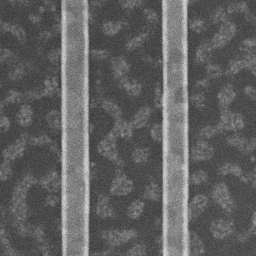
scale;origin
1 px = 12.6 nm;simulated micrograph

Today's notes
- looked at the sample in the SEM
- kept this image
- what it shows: one or a few lines or trenches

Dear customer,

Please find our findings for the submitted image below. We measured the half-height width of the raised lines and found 268 nm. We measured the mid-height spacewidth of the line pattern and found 982 nm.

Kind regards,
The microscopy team